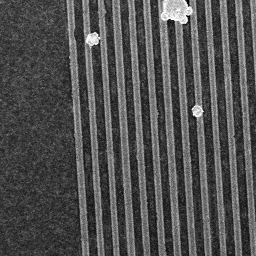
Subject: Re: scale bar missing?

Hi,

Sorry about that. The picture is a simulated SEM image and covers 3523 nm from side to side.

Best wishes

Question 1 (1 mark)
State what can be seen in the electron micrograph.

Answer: parallel lines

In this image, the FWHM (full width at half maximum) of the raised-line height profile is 72.1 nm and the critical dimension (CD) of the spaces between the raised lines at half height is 0.132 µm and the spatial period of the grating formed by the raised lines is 210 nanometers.